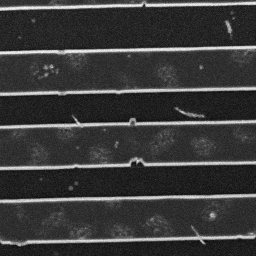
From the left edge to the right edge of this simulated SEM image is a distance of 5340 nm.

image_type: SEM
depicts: one or a few lines or trenches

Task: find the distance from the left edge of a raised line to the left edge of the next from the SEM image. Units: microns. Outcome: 1.55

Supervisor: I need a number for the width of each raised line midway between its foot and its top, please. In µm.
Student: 0.876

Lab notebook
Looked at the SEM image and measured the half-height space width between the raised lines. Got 678 nanometres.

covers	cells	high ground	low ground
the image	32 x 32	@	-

@@@@@@@@@@@@@@@@@@@@@@@@@@------
--------------------------------
--------------------------------
--------------------------------
--------------------------------
--------------------------------
---@@@@-@@@@@@@@@@@@@@@@@@@@@@@@
@@@@@@@@@@@@@@@@@@@@@@@@@@@@@@@@
@@@@@@@@@@@@@@@@@@@@@@@@@@@@@@@@
@@@@@@@@@@@@@@@@@@@@@@@@@@@@@@@@
@@@@@@@@@@@@@@@@@@@@@@@@@@@@@@@@
@@@@@@@@@@----@-----------------
--------------------------------
--------------------------------
--------------------------------
--------------@@@@@@@@@@@@@@@@@@
@@@@@@@@@@@@@@@@@@@@@@@@@@@@@@@@
@@@@@@@@@@@@@@@@@@@@@@@@@@@@@@@@
@@@@@@@@@@@@@@@@@@@@@@@@@@@@@@@@
@@@@@@@@@@@@@@@@@@@@@@@@@@@@@@@@
@@@@@@@@@@@@@@@@--@---@@--------
--------------------------------
--------------------------------
--------------------------------
-------------------------------@
@@@@@@@@@@@@@@@@@@@@@@@@@@@@@@@@
@@@@@@@@@@@@@@@@@@@@@@@@@@@@@@@@
@@@@@@@@@@@@@@@@@@@@@@@@@@@@@@@@
@@@@@@@@@@@@@@@@@@@@@@@@@@@@@@@@
@@@@@@@@@@@@@@@@@@@@@@@@@@@@@@@@
--@-----------------------------
--------------------------------